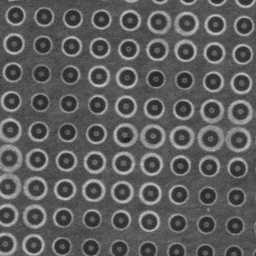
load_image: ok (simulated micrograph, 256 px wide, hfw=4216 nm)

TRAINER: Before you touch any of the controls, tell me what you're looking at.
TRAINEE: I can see an array of small figures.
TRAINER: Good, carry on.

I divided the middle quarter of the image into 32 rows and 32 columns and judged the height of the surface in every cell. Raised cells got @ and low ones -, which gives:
@@@@@@@@@@@@@@@@@@@@@@@@@@@@@@@@
---@@@@---@@@@@--@@@@@@@@@@@@@@@
----@@-----@@@----@@@---@@@@@--@
---@@@-----@@--@--@@@----@@@----
---@@@@----@@@----@@@----@@@----
@@@@@@@@-@@@@@---@@@@@--@@@@@---
@@@@@@@@@@@@@@@@@@@@@@@@@@@@@@@@
@@@@@@@@@@@@@@@@@@@@@@@@@@@@@@@@
---@@@@---@@@@---@@@@@@@@@@@@@@@
---@@@-----@@@----@@@---@@@@@--@
---@@@-----@@--@--@@-----@@@----
---@@@@---@@@-----@@-----@@@----
@@@@@@@@@@@@@@---@@@@---@@@@----
@@@@@@@@@@@@@@@@@@@@@@@@@@@@@--@
@@@@@@@@@@@@@@@@@@@@@@@@@@@@@@@@
--@@@@@--@@@@@--@@@@@@@@@@@@@@@@
---@@@----@@@----@@@----@@@@---@
---@@@----@@@-----@@-----@@-----
---@@@----@@@-----@@-----@@--@--
@@@@@@@--@@@@@---@@@----@@@-----
@@@@@@@@@@@@@@@@@@@@@--@@@@@---@
@@@@@@@@@@@@@@@@@@@@@@@@@@@@@@@@
--@@@@---@@@@@@-@@@@@@@@@@@@@@@@
---@@@----@@@----@@@----@@@@--@@
---@@--@--@@-----@@@----@@@----@
--@@@@----@@@----@@@----@@@----@
-@@@@@---@@@@----@@@----@@@----@
@@@@@@@@@@@@@@@@@@@@@-@@@@@@--@@
@@@@@@@@@@@@@@@@@@@@@@@@@@@@@@@@
--@@@@--@@@@@@@@@@@@@@@@@@@@@@@@
--@@@-----@@@---@@@@---@@@@@-@@@
---@@-----@@-----@@-----@@@---@@